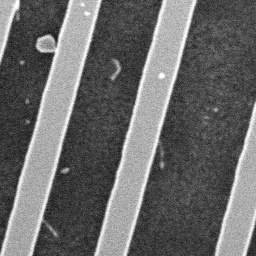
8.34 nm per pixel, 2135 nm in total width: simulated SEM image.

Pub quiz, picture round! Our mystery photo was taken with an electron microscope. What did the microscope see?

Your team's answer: lines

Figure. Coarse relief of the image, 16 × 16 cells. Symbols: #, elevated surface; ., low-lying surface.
#...##....##....
#...##....##....
....##....##....
...##....##.....
...##....##.....
...##....##.....
...##...##......
..##....##......
..##....##.....#
..##....##.....#
.##....##......#
.##....##......#
.##....##.....##
.##....##.....##
##....##......##
##....##......#.